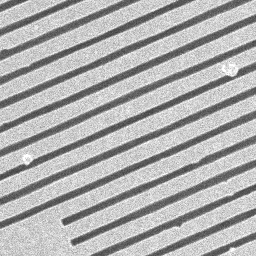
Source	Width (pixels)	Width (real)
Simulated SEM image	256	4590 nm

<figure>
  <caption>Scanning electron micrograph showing parallel lines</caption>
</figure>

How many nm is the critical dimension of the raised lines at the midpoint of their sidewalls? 267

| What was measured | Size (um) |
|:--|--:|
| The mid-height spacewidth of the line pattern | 0.123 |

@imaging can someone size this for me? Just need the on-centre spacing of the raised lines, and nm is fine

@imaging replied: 397